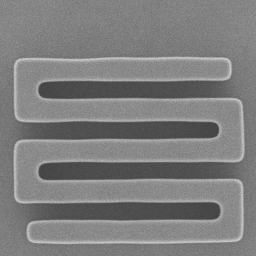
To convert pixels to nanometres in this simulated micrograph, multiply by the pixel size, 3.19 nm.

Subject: groups of lines, slits or small figures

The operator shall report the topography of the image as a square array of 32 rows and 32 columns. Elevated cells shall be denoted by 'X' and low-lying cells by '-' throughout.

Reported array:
--------------------------------
--------------------------------
--------------------------------
--------------------------------
--------------------------------
--------------------------------
--------------------------------
--XXXXXXXXXXXXXXXXXXXXXXXXXXX---
--XXXXXXXXXXXXXXXXXXXXXXXXXXX---
--XXXXXXXXXXXXXXXXXXXXXXXXXXX---
--XXX---------------------------
--XXX---------------------------
--XXXXXXXXXXXXXXXXXXXXXXXXXXXX--
--XXXXXXXXXXXXXXXXXXXXXXXXXXXX--
--XXXXXXXXXXXXXXXXXXXXXXXXXXXX--
---------------------------XXX--
---------------------------XXX--
---XXXXX-XXXXXXXXXXXXXXXXXXXXX--
--XXXXXXXXXXXXXXXXXXXXXXXXXXXX--
--XXXXXXXXXXXXXXXXXXXXXXXXXXXX--
--XXX---------------------------
--XXX---------------------------
--XXXX----------XXXXXXXXXXXXXX--
--XXXXXXXXXXXXXXXXXXXXXXXXXXXX--
--XXXXXXXXXXXXXXXXXXXXXXXXXXXX--
---------------------------XXX--
----------------------------XX--
--------------------XXXX--XXXX--
---XXXXXXXXXXXXXXXXXXXXXXXXXXX--
---XXXXXXXXXXXXXXXXXXXXXXXXXXX--
--------------------------------
--------------------------------